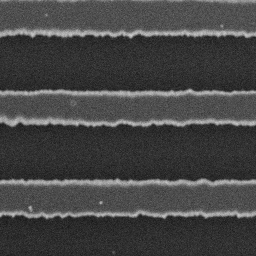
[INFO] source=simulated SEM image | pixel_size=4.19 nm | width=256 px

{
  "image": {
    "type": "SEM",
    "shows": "lines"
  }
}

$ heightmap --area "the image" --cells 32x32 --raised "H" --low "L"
HHHHHHHHHHHHHHHHHHHHHHHHHHHHHHHH
HHHHHHHHHHHHHHHHHHHHHHHHHHHHHHHH
HHHHHHHHHHHHHHHHHHHHHHHHHHHHHHHH
HHHHHHHHHHHHHHHHHHHHHHHHHHHHHHHH
LLLLLLLHHLLLLLHLHLHLLLLLHLLLLLHH
LLLLLLLLLLLLLLLLLLLLLLLLLLLLLLLL
LLLLLLLLLLLLLLLLLLLLLLLLLLLLLLLL
LLLLLLLLLLLLLLLLLLLLLLLLLLLLLLLL
LLLLLLLLLLLLLLLLLLLLLLLLLLLLLLLL
LLLLLLLLLLLLLLLLLLLLLLLLLLLLLLLL
LLLLLLLLLLLLLLLLLLLLLLLLLLLLLLLL
HHHHHHHHHHHHHHHHHHHHLHHHHHHHLHHH
HHHHHHHHHHHHHHHHHHHHHHHHHHHHHHHH
HHHHHHHHHHHHHHHHHHHHHHHHHHHHHHHH
HHHHHHHHHHHHHHHHHHHHHHHHHHHHHHHH
LHLHLLLLHHHHHHHLHHHLLHHHLLLLLHHH
LLLLLLLLLLLLLLLLLLLLLLLLLLLLLLLL
LLLLLLLLLLLLLLLLLLLLLLLLLLLLLLLL
LLLLLLLLLLLLLLLLLLLLLLLLLLLLLLLL
LLLLLLLLLLLLLLLLLLLLLLLLLLLLLLLL
LLLLLLLLLLLLLLLLLLLLLLLLLLLLLLLL
LLLLLLLLLLLLLLLLLLLLLLLLLLLLLLLL
LLLLLLLLLLLLLLLLLLLLLLLLLHLLLLLL
HHHHHHHHHHHHHHHHHHHHHHHHHHHHHHHH
HHHHHHHHHHHHHHHHHHHHHHHHHHHHHHHH
HHHHHHHHHHHHHHHHHHHHHHHHHHHHHHHH
HHHHHHHHHHHHHHHHHHHHHHHHHHHHHHHH
LLLLLLLLLLLLLLLLLLLLLLLLLLLLLLLL
LLLLLLLLLLLLLLLLLLLLLLLLLLLLLLLL
LLLLLLLLLLLLLLLLLLLLLLLLLLLLLLLL
LLLLLLLLLLLLLLLLLLLLLLLLLLLLLLLL
LLLLLLLLLLLLLLLLLLLLLLLLLLLLLLLL